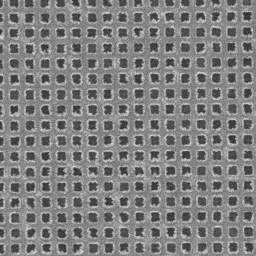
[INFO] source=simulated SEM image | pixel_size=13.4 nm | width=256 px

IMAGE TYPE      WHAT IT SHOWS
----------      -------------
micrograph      a regular array of holes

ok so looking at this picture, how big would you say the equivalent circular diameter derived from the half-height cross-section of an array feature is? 131 nanometers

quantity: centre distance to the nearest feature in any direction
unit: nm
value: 201